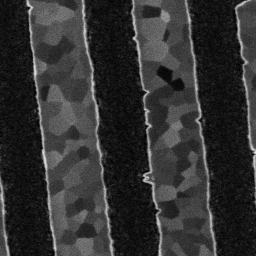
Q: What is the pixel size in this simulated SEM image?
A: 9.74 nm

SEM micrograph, one or a few lines or trenches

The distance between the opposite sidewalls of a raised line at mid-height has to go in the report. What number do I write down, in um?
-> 0.536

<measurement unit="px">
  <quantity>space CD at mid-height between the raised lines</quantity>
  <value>48.1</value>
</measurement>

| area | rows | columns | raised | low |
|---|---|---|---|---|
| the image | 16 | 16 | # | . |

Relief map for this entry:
..###...####...#
..###...####...#
..###...####...#
..####...###...#
..####...###...#
..####...###...#
..####...###...#
...###...###....
...###...####...
...###...####...
...###...####...
...####..####...
...####...###...
...####...###...
...####...###...
...####...###...